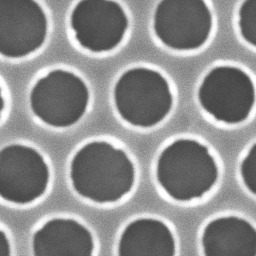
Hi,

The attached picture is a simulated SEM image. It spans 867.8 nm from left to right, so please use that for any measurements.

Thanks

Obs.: holes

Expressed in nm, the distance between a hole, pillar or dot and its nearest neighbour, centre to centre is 287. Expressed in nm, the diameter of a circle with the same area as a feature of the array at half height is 200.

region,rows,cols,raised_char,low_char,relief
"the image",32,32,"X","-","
-----XXXXX-----XXXXX------XXXX--
-----XXXX------XXXX-------XXXX--
------XXX-------XXX-------XXXX--
------XXX-------XXX-------XXXX--
------XXX------XXXXX------XXXX--
-----XXXXX-----XXXXXX----XXXXXX-
----XXXXXXXXXXXXXXXXXXXXXXXXXXXX
XXXXXXXXXXXXXXXXXXXXXXXXXXXXXXXX
XXXXXXXXXXXXXXXXX-XXXXXXXXX---XX
XXXXXX----XXXXX-----XXXXXX-----X
XXXX-------XXX-------XXXX-------
XXXX-------XXX-------XXXX-------
XXXX-------XXX--------XXX-------
XXXX-------XXXX------XXXXX-----X
XXXXX-----XXXXX------XXXXX-----X
XXXXXX---XXXXXXX----XXXXXXXXXXXX
XXXXXXXXXXXXXXXXXXXXXXXXXXXXXXXX
XXXXXXXXXXXXXXXXXXXXXX--XXXXXXXX
----XXXXXX-----XXXXXX-----XXXXX-
-----XXXX-------XXXX------XXXXX-
------XXX--------XXX-------XXX--
------XXX--------XX--------XXX--
------XXX--------XXX-------XXX--
------XXX-------XXXX------XXXXX-
-----XXXXX-----XXXXXX----XXXXXXX
XX-XXXXXXXXXXXXXXXXXXXXXXXXXXXXX
XXXXXXXXXXXXXXXXXXXXXXXXXXXXXXXX
XXXXXX---XXXXXXXX---XXXXXXX----X
XXXXX------XXXXX-----XXXXX------
-XXX--------XXX-------XXX-------
-XXX--------XXX-------XXX-------
-XXX--------XXX-------XXXX------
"